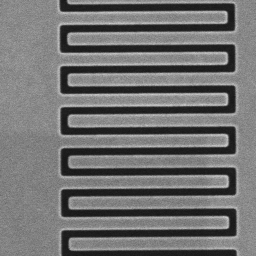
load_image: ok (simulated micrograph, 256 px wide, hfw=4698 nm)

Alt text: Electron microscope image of groups of lines, slits or small figures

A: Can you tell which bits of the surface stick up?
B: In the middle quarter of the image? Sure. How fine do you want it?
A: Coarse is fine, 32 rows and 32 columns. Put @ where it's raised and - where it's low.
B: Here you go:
--------------------------------
--------------------------------
-------@@@@@@@@@@@@@@@@@@@@@@@@@
-@@@@@@@@@@@@@@@@@@@@@@@@@@@@@@@
-@@@@@@@@@@@@@@@@@@@@@@@@@@@@@@@
--------------------------------
--------------------------------
-----------------@@@@@@@@@@@@@@@
@@@@@@@@@@@@@@@@@@@@@@@@@@@@@@@@
@@@@@@@@@@@@@@@@@@@@@@@@@@@@@@@@
--------------------------------
--------------------------------
--------------------------------
-@@@@@@@@@@@@@@@@@@@@@@@@@@@@@@@
-@@@@@@@@@@@@@@@@@@@@@@@@@@@@@@@
-@@@@@@@@@@@@@@@@@@@@@@@@@@@@@@@
--------------------------------
--------------------------------
@@@@@@@@@@@@@@@@@@@@@@@@@@@@@@@@
@@@@@@@@@@@@@@@@@@@@@@@@@@@@@@@@
@@@@@@@@@@@@@@@@@@@@@@@@@@@@@@@@
--------------------------------
--------------------------------
-@@@@@@@@@@@@@@@@@@@@@@@@@@@@@@@
-@@@@@@@@@@@@@@@@@@@@@@@@@@@@@@@
-@@@@@@@@@@@@@@@@@@@@@@@@@@@@@@@
--------------------------------
--------------------------------
@@@@@@@@@@@@@@@@@@@@@@@@@@@@@@@@
@@@@@@@@@@@@@@@@@@@@@@@@@@@@@@@@
@@@@@@@@@@@@@@@@@@@@@@@@@@@@@@@@
--------------------------------